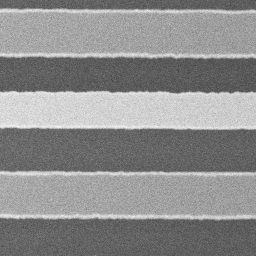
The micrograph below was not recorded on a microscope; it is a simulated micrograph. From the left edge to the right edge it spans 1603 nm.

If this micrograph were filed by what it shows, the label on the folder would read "lines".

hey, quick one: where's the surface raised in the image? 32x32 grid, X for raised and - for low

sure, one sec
--------------------------------
XXXXXXXXXXXXXXXXXXXXXXXXXXXXXXXX
XXXXXXXXXXXXXXXXXXXXXXXXXXXXXXXX
XXXXXXXXXXXXXXXXXXXXXXXXXXXXXXXX
XXXXXXXXXXXXXXXXXXXXXXXXXXXXXXXX
XXXXXXXXXXXXXXXXXXXXXXXXXXXXXXXX
XXXXXXXXXXXXXXXXXXXXXXXXXXXXXXXX
--------------------------------
--------------------------------
--------------------------------
--------------------------------
-X--XX--X--XXX--X--XX-----------
XXXXXXXXXXXXXXXXXXXXXXXXXXXXXXXX
XXXXXXXXXXXXXXXXXXXXXXXXXXXXXXXX
XXXXXXXXXXXXXXXXXXXXXXXXXXXXXXXX
XXXXXXXXXXXXXXXXXXXXXXXXXXXXXXXX
--------------------------------
--------------------------------
--------------------------------
--------------------------------
--------------------------------
X-XXXXXX-X--X-------------------
XXXXXXXXXXXXXXXXXXXXXXXXXXXXXXXX
XXXXXXXXXXXXXXXXXXXXXXXXXXXXXXXX
XXXXXXXXXXXXXXXXXXXXXXXXXXXXXXXX
XXXXXXXXXXXXXXXXXXXXXXXXXXXXXXXX
XXXXXXXXXXXXXXXXXXXXXXXXXXXXXXXX
--------------------------------
--------------------------------
--------------------------------
--------------------------------
--------------------------------